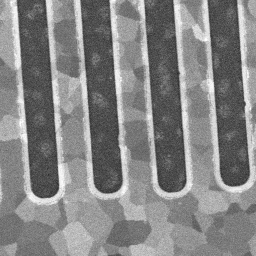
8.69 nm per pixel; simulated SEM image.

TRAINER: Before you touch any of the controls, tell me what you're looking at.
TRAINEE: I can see one or a few lines or trenches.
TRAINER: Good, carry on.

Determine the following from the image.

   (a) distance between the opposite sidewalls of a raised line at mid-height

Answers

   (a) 29.6 px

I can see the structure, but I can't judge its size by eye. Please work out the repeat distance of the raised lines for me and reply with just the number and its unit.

63.5 px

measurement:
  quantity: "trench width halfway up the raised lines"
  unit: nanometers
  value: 296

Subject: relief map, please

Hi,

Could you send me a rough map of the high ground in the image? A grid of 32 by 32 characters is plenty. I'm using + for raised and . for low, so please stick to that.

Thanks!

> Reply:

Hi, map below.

++....++++....++++....++++....++
++....++++....++++....++++....++
++....++++....++++....++++....++
++....++++....++++....++++....++
++....++++....++++....++++....++
++....++++....++++....++++....++
++.....+++....++++.....+++....++
++.....+++.....+++.....+++.....+
++.....+++.....+++.....+++.....+
++.....+++.....+++.....+++.....+
+++....+++.....+++.....+++.....+
+++....++++....++++....+++.....+
+++....++++....++++....++++....+
+++....++++....++++....++++....+
+++....++++....++++....++++....+
+++....++++....++++....++++....+
+++....++++....++++....++++....+
+++....++++....++++....++++....+
+++....++++....++++....++++....+
+++.....+++....++++....++++....+
+++.....+++.....+++.....+++....+
+++.....+++.....+++.....+++.....
+++.....+++.....+++.....+++....+
++++....++++...+++++...+++++..++
++++...++++++.++++++++++++++++++
++++++++++++++++++++++++++++++++
++++++++++++++++++++++++++++++++
++++++++++++++++++++++++++++++++
++++++++++++++++++++++++++++++++
++++++++++++++++++++++++++++++++
++++++++++++++++++++++++++++++++
++++++++++++++++++++++++++++++++